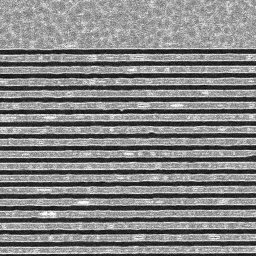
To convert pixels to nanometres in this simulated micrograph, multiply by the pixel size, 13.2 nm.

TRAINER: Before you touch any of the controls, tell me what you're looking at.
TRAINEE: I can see parallel lines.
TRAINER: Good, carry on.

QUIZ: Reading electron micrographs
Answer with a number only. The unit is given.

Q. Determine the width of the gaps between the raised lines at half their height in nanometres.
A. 59.3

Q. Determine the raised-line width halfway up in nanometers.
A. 93.9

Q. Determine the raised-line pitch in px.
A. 12